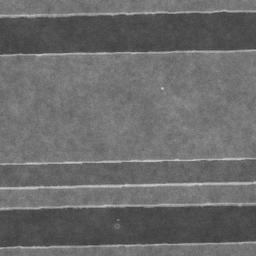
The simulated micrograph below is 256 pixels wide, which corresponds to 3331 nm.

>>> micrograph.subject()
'lines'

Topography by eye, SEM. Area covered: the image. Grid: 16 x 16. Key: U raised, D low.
UUUUUUUUUUUUUUUU
DDDDDDDDDDDDDDDD
DDDDDDDDDDDDDDDD
UUUUUUUUUUUUUUUU
UUUUUUUUUUUUUUUU
UUUUUUUUUUUUUUUU
UUUUUUUUUUUUUUUU
UUUUUUUUUUUUUUUU
UUUUUUUUUUUUUUUU
UUUUUUUUUUUUUUUU
UUUUUUUUUUUUUUUU
UUUUUUUUUUUUUUUU
UUUUUUUUUUUUUUUU
DDDDDDDDDDDDDDDD
DDDDDDDDDDDDDDDD
UUUUUUUUUUUUUUUU